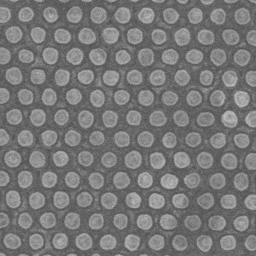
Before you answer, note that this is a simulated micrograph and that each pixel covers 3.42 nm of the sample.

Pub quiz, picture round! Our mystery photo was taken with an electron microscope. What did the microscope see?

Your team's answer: a regular array of raised bodies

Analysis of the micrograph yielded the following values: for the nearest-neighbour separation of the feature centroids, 79.1 nanometres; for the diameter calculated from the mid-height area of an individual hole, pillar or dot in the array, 50.4 nanometres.